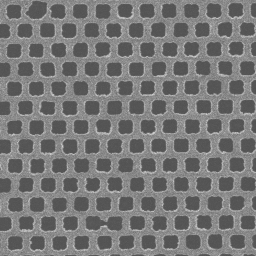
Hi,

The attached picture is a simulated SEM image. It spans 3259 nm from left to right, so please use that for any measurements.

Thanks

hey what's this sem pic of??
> a regular array of holes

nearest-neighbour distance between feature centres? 277 nm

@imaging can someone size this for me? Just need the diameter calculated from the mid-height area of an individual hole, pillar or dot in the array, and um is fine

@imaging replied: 0.198